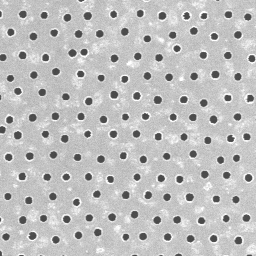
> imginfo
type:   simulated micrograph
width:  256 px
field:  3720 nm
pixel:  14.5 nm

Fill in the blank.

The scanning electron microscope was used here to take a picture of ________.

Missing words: a regular array of holes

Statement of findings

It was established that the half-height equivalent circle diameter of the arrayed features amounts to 0.111 microns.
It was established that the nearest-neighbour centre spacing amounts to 291 nanometres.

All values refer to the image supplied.